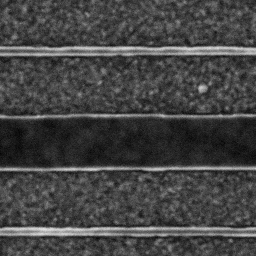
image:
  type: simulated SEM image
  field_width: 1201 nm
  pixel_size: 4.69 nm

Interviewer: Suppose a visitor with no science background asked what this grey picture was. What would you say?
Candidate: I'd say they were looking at lines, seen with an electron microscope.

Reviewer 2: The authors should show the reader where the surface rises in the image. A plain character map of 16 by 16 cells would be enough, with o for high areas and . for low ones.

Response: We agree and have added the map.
................
................
................
................
................
................
................
oooooooooooooooo
oooooooooooooooo
oooooooooooooooo
oooooooooooooooo
................
................
................
................
................